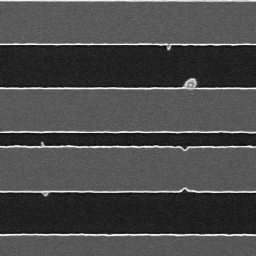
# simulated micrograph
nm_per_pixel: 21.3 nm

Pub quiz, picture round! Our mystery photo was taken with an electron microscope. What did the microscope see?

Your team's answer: one or a few lines or trenches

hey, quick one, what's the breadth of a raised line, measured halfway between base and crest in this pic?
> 939 nanometers